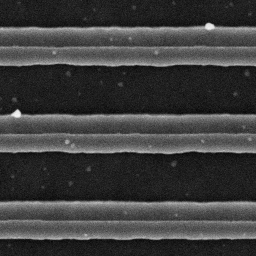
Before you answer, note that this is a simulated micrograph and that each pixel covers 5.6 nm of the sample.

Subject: lines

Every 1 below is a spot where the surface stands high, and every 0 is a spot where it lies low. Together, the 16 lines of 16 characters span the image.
0000000000000000
0000000000000000
1111111111111111
1111111111111111
0000000000000000
0000000000000000
0000000000000000
1111111111111111
1111111111111111
0000111011100011
0000000000000000
0000000000000000
0000000000000000
1111111111111111
1111111111111111
0000000000000000